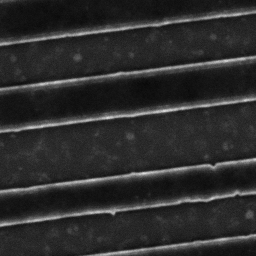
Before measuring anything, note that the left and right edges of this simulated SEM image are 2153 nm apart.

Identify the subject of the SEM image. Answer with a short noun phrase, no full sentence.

one or a few lines or trenches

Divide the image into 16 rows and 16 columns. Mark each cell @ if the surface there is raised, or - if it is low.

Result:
@@@@@@@@@@@@@@@@
@@@@@@@@@@------
@@--------------
----------------
--------@@@@@@@@
-@@@@@@@@@@@@@@@
@@@@@@@@@@@@@@--
@@@@@@----------
----------------
----------------
------------@@@@
----@@@@@@@@@@@@
@@@@@@@@@@@@@---
@@@@------------
----------------
----------@@@@@@